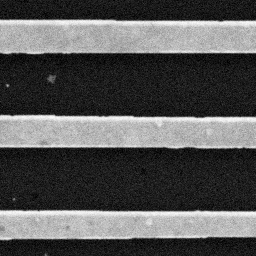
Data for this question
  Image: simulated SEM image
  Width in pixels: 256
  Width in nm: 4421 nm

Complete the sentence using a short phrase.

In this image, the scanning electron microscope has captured lines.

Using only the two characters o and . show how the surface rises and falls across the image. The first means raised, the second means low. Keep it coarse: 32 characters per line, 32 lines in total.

................................
................................
................................
oooooooooooooooooooooooooooooooo
oooooooooooooooooooooooooooooooo
oooooooooooooooooooooooooooooooo
oooooooooooooooooooooooooooooooo
................................
................................
................................
................................
................................
................................
................................
................................
oooooooooooooooooooooooooooooooo
oooooooooooooooooooooooooooooooo
oooooooooooooooooooooooooooooooo
................................
................................
................................
................................
................................
................................
................................
................................
................................
oooooooooooooooooooooooooooooooo
oooooooooooooooooooooooooooooooo
oooooooooooooooooooooooooooooooo
................................
................................